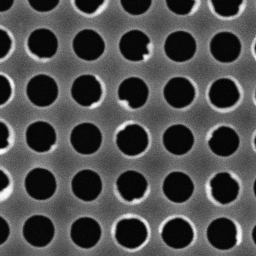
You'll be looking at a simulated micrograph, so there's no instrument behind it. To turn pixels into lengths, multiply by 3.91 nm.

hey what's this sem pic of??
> a regular array of holes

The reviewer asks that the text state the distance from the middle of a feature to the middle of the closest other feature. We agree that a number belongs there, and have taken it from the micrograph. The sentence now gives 177 nm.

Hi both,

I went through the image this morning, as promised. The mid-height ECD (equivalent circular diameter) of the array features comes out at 122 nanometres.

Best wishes